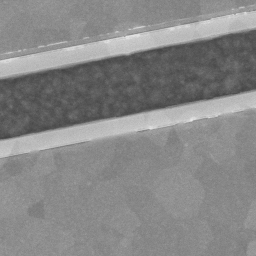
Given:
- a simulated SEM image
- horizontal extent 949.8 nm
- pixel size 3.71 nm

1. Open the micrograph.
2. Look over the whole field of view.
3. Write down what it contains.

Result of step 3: one or a few lines or trenches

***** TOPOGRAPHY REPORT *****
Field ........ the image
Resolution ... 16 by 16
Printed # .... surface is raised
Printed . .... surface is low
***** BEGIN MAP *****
################
###############.
##########......
#####...........
................
................
..............##
.........#######
....############
################
################
################
################
################
################
################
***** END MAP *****